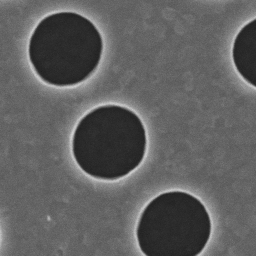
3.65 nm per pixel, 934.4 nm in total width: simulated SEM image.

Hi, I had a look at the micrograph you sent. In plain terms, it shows holes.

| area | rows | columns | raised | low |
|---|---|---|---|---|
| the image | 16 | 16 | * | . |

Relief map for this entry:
****************
**....**********
**....*********.
**....*********.
**....*********.
****************
****************
*****....*******
*****....*******
*****....*******
*****...********
****************
**********..****
*********....***
*********....***
*********....***